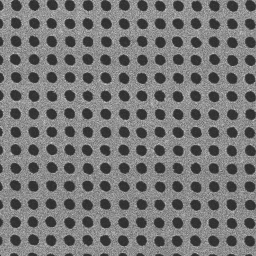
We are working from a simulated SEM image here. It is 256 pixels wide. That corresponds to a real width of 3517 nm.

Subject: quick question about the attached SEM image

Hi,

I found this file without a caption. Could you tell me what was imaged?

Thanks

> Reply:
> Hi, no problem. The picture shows a regular array of holes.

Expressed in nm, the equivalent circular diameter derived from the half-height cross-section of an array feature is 151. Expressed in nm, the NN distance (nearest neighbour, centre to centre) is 243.